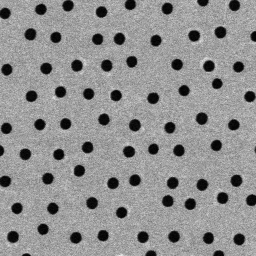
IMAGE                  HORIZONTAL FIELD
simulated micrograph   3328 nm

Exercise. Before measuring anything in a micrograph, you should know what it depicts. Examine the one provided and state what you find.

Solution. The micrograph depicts a regular array of holes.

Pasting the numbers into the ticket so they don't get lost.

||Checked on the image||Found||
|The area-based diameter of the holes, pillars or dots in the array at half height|11.8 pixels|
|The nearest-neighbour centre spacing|347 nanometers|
